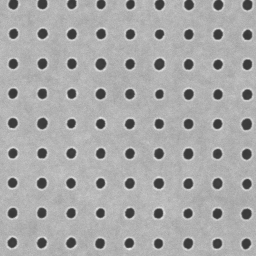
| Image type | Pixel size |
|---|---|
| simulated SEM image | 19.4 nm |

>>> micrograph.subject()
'a regular array of holes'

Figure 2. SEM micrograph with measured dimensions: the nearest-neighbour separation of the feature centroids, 0.565 microns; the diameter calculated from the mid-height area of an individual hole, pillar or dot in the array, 205 nm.